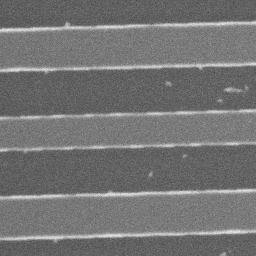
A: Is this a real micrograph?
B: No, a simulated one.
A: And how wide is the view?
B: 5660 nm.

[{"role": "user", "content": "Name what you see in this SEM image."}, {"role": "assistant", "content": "lines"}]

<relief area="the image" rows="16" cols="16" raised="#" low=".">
................
...........#####
################
################
................
................
................
################
################
................
................
................
################
################
################
................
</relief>